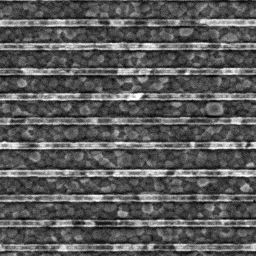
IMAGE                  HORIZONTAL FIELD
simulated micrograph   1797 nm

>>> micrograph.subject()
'parallel lines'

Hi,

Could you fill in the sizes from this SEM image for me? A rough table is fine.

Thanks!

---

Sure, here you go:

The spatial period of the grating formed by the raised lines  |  175 nm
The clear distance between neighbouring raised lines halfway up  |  135 nanometres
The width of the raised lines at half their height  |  40.4 nanometres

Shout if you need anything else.